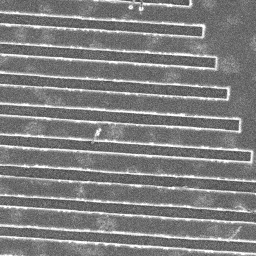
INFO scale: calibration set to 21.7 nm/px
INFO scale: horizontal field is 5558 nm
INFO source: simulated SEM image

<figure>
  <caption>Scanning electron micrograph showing parallel lines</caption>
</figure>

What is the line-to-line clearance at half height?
230 nm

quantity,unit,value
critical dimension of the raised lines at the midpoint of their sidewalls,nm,420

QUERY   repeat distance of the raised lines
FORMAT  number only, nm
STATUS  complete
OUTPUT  658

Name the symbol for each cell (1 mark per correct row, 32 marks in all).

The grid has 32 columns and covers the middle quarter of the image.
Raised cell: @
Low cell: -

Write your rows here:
@@@@@@@@@@@@@@@@@@@@@@@@@@@-----
@@@@@@@@@@@@@@@@@@@@@@@@@@@@@@@@
@@@@@@@@@@@@@@@@@@@@@@@@@@@@@@@@
--@@@@@@@@@@@@@@@@@@@@@@@@@@@@@@
------------------@@@@@@@@@@@@@@
--------------------------------
@@@@@---------------------------
@@@@@@@@@@@@@@@@@@@@------------
@@@@@@@@@@@@@@@@@@@@@@@@@@@@@@@@
@@@@@@@@@@@@@@@@@@@@@@@@@@@@@@@@
@@@@@@@@@@@@@@@@@@@@@@@@@@@@@@@@
----------@@@@@@@@@@@@@@@@@@@@@@
-------------------------@@@@@@@
--------------------------------
@@@@@@--@-----------------------
@@@@@@@@@@@@@@@@@@@@@@@@--------
@@@@@@@@@@@@@@@@@@@@@@@@@@@@@@@@
@@@@@@@@@@@@@@@@@@@@@@@@@@@@@@@@
@@@@@@@@@@@@@@@@@@@@@@@@@@@@@@@@
-------@------@@@@@@@@@@@@@@@@@@
---------------------------@@@@@
--------------------------------
@@@@@@@@@@@@@-------------------
@@@@@@@@@@@@@@@@@@@@@@@@@@@@@@@-
@@@@@@@@@@@@@@@@@@@@@@@@@@@@@@@@
@@@@@@@@@@@@@@@@@@@@@@@@@@@@@@@@
------@@@@@@@@@@@@@@@@@@@@@@@@@@
-------------------@@@@@@@@@@@@@
--------------------------------
@@@@@@--------------------------
@@@@@@@@@@@@@@@@@@@@@-----------
@@@@@@@@@@@@@@@@@@@@@@@@@@@@@@@@